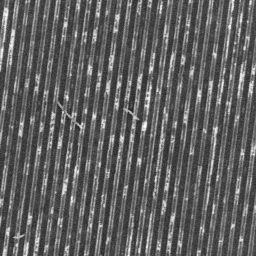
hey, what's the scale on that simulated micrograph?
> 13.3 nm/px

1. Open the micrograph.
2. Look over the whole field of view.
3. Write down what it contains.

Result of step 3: parallel lines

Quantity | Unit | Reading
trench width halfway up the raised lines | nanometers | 84.4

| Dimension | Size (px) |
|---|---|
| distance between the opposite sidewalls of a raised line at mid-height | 3.6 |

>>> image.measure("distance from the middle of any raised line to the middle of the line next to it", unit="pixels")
10.1